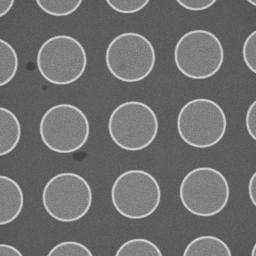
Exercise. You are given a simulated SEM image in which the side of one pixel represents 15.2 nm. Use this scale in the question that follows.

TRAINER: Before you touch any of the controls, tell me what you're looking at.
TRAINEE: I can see an array of small figures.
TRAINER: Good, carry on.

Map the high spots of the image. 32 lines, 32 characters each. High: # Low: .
##...#####....####....#####.....
#.....###......##...............
................................
................................
.......#.......###.....####....#
#....#####....#####...######...#
##...######..######...######..##
##...######..######...######...#
##...######...#####...#####....#
##...#####....####.....###......
#...............................
................................
........................##......
......####.....####....#####...#
##...######...#####...######...#
##...######...######..######...#
##...######...######..######...#
##...######...#####....####.....
##....####.....###..............
................................
................................
................##......###.....
#.....#####....####....#####...#
###...#####...######...######..#
###..######...######...######..#
###...#####...######...#####....
##....#####....####.....###.....
##.....###......................
................................
................................
........##......###.....####....
##....#####....#####...######..#